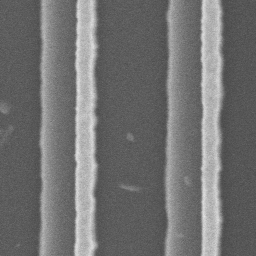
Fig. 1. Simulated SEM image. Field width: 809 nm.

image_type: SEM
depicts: lines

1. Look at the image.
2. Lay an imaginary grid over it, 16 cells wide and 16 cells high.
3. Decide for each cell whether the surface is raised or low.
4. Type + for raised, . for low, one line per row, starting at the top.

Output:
...+++.....+++..
...+++.....+++..
...+++.....+++..
...+++.....+++..
...+++.....+++..
...+++.....+++..
...+++.....+++..
...+++.....+++..
...+++.....+++..
...+++.....+++..
...+++.....+++..
...+++.....+++..
...+++.....+++..
...+++.....+++..
...+++.....+++..
...+++.....+++..